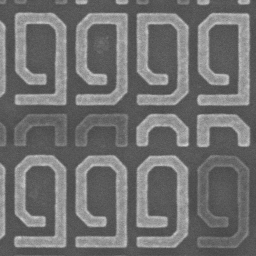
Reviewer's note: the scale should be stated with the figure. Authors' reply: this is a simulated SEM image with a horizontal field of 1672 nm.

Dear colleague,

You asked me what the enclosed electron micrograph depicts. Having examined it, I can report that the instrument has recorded wiring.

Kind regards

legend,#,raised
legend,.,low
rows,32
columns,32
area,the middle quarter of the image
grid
#..###.......###..###........##.
#..###.......###..###........##.
#..#####.....###...####......##.
#...#######..###....######...##.
#....######..###.....#####...##.
.............###.............##.
.............###............###.
...........####............###..
...###########....############..
...##########.....###########...
................................
................................
................................
#....###########.....########...
#...############....##########..
#..#####.#######...###########..
#..###.......###..###.......###.
#..###.......###..###.......###.
#..###.......###..###.......###.
#..###.......###..###.......###.
.............##.................
................................
................................
......#######........#######....
.....#########......#########...
...####....####....####....###..
...###......####..###.......###.
...##........###..###.......###.
...##........###..###........##.
...##........###..###........##.
...##........###..###........##.
...##........###..###.......###.